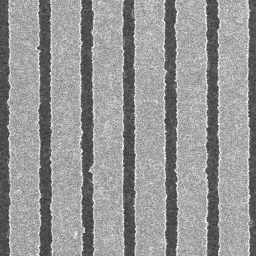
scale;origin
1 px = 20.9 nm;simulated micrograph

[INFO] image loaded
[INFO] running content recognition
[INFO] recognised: parallel lines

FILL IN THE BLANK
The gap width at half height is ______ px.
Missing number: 12.1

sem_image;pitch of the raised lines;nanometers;873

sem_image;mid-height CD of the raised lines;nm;622